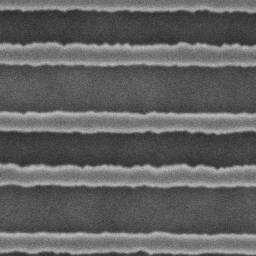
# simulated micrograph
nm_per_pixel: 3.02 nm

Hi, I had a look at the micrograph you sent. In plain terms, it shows lines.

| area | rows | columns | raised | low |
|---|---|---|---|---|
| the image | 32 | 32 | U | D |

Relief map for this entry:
UUUUUUUUUUUUUUUUUUUUUUUUUUUUUUUU
DDDDDDDDDDDDDDDDDDDDDDDDDDDDDDDU
DDDDDDDDDDDDDDDDDDDDDDDDDDDDDDDD
DDDDDDDDDDDDDDDDDDDDDDDDDDDDDDDD
DDDDDDDDDDDDDDDDDDDDDDDDDDDDDDDD
UDDDUUUDDUDDDDDDDDDDDDUUDDDDDDDD
UUUUUUUUUUUUUUUUUUUUUUUUUUUUUUUU
UUUUUUUUUUUUUUUUUUUUUUUUUUUUUUUU
DDDDDDDDDDDDDDDDDDDDDDDDDDDDDDDD
DDDDDDDDDDDDDDDDDDDDDDDDDDDDDDDD
DDDDDDDDDDDDDDDDDDDDDDDDDDDDDDDD
DDDDDDDDDDDDDDDDDDDDDDDDDDDDDDDD
DDDDDDDDDDDDDDDDDDDDDDDDDDDDDDDD
DDDDDDDDDDDDDDDDDDDDDDDDDDDDDDDD
UUUUUUUUUUUUUUUUUUUUUUUUUUUUUUUU
UUUUUUUUUUUUUUUUUUUUUUUUUUUUUUUU
DDDDDDDDUDUUDDUUUUDUDDDDDUUUUDDD
DDDDDDDDDDDDDDDDDDDDDDDDDDDDDDDD
DDDDDDDDDDDDDDDDDDDDDDDDDDDDDDDD
DDDDDDDDDDDDDDDDDDDDDDDDDDDDDDDD
DDDDDDDDDDDDDDDDDDDDDDDDDDDDDDDD
UUUUUUUUUUUUUUUUUUUUUUUUUUUUUUUU
UUUUUUUUUUUUUUUUUUUUUUUUUUUUUUUU
DDDDDDDDDDDDDDDDDDDDDDDDDDDDDDDD
DDDDDDDDDDDDDDDDDDDDDDDDDDDDDDDD
DDDDDDDDDDDDDDDDDDDDDDDDDDDDDDDD
DDDDDDDDDDDDDDDDDDDDDDDDDDDDDDDD
DDDDDDDDDDDDDDDDDDDDDDDDDDDDDDDD
DDDDDDDDDDDDDDDDDDDDDDDDDDDDDDDD
UUUUUUUUUUUUUUUUUUUUUUUUUUUUUUUU
UUUUUUUUUUUUUUUUUUUUUUUUUUUUUUUU
UDDUUDDUUUUUUUUUUDUUUUUUUUUUUUUU